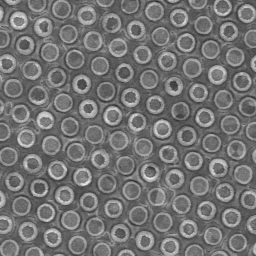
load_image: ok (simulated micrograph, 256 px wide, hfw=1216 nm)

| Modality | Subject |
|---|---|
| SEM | a regular array of raised bodies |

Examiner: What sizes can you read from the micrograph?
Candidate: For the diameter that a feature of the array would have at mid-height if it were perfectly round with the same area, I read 17.1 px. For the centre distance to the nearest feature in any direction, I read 121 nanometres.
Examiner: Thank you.